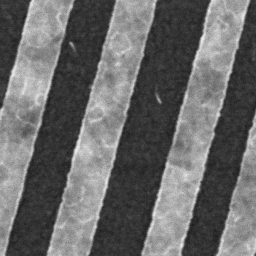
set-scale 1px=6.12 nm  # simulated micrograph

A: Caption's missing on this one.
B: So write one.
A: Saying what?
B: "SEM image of one or a few lines or trenches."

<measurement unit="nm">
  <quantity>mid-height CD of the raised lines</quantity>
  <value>226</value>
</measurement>